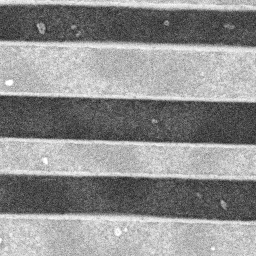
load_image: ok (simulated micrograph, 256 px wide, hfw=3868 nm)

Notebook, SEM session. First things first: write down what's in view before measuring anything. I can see lines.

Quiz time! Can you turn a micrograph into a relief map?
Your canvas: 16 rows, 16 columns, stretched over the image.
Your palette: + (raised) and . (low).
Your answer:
................
................
................
++++++++++++++++
++++++++++++++++
++++++++++++++++
................
................
................
++++++++++++++++
++++++++++++++++
................
................
................
++++++++++++++++
++++++++++++++++